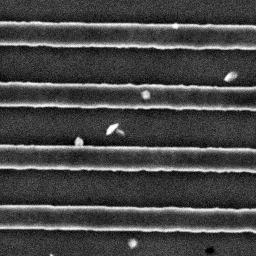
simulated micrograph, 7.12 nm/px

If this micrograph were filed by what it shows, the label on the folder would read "lines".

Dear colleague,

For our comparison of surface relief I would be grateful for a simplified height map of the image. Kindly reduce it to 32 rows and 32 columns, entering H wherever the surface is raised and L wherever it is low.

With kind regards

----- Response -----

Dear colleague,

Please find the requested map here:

LLLLLLLLLLLLLLLLLLLLLLLLLLLLLLLL
LLLLLLLLLLLLLLLLLLLLLLLLLLLLLLLL
LLLLLLLLLLLLLLLLLLLLLLLLLLLLLLLL
HHHHHHHHHHHHHHHHHHHHHHHHHHHHHHHH
HHHHHHHHHHHHHHHHHHHHHHHHHHHHHHHH
HHHHHHHHHHHHHHHHHHHHHHHHHHHHHHHH
LLLLLLLLLLLLLLLLLLLLLLLLLLLLLLLL
LLLLLLLLLLLLLLLLLLLLLLLLLLLLLLLL
LLLLLLLLLLLLLLLLLLLLLLLLLLLLLLLL
LLLLLLLLLLLLLLLLLLLLLLLLLLLLLLLL
HHHHHLHLLLLLLLLLLLLLLLLLLLLLLLLL
HHHHHHHHHHHHHHHHHHHHHHHHHHHHHHHH
HHHHHHHHHHHHHHHHHHHHHHHHHHHHHHHH
LLLLLLLLLLLLLLLLHLHLLHHHHHHHHHHH
LLLLLLLLLLLLLLLLLLLLLLLLLLLLLLLL
LLLLLLLLLLLLLLLLLLLLLLLLLLLLLLLL
LLLLLLLLLLLLLLLLLLLLLLLLLLLLLLLL
LLLLLLLLLLLLLLLLLLLLLLLLLLLLLLLL
HHHHHHHHHHHHHHHHHHLLLLLLLLLLLLLL
HHHHHHHHHHHHHHHHHHHHHHHHHHHHHHHH
HHHHHHHHHHHHHHHHHHHHHHHHHHHHHHHH
LLLLLLLLLLLLLLLLLLLLLLLLLLLLLLLH
LLLLLLLLLLLLLLLLLLLLLLLLLLLLLLLL
LLLLLLLLLLLLLLLLLLLLLLLLLLLLLLLL
LLLLLLLLLLLLLLLLLLLLLLLLLLLLLLLL
LLLLLLLLLLLLLLLLLLLLLLLLLLLLLLLL
HHHHHHHHHHHHHHHHHHHHHHHHHHHHHHHH
HHHHHHHHHHHHHHHHHHHHHHHHHHHHHHHH
HHHHHHHHHHHHHHHHHHHHHHHHHHHHHHHH
LLLLLLLLLLLLLLLLLLLLLLLLLLLLLLLL
LLLLLLLLLLLLLLLLLLLLLLLLLLLLLLLL
LLLLLLLLLLLLLLLLLLLLLLLLLLLLLLLL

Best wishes